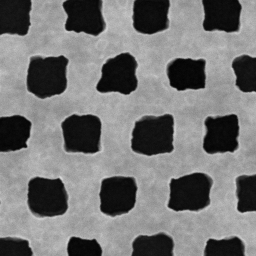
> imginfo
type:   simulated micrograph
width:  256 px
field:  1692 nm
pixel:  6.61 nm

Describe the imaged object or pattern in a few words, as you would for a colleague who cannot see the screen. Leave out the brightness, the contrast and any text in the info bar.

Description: a regular array of holes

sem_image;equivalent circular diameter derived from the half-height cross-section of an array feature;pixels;40.9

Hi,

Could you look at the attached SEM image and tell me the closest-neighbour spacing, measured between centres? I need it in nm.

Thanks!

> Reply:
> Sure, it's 447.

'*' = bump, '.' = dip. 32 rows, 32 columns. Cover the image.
....****.....****....****.....**
....****.....****....*****....**
....****.....****....*****....**
....****.....****....*****....**
********************************
********************************
********************************
****....******...*****..*****...
****....*****....****.....***...
***.....*****....****.....****..
***.....****.....****.....****..
****....*******..***************
********************************
********************************
**.******...********.*******.***
....****.....****.....****....**
....****.....****.....****....**
...*****....****......***.....**
...*****....*****.....***....***
********************************
********************************
********************************
****....*****....*****....****..
***.....*****....****.....****..
***.....****.....****.....****..
****....*****....****.....****..
****....*****...**************.*
********************************
********************************
******************...***********
....*****...*****.....****....**
....*****....****....*****....**